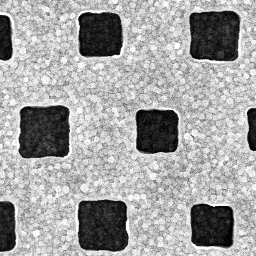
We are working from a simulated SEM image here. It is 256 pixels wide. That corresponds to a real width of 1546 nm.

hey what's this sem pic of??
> holes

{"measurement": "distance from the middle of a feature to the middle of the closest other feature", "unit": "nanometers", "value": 663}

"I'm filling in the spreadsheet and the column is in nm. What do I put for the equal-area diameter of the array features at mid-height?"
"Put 312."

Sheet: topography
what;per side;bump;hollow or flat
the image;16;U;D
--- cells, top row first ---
UUUUUUUUUUUUUUUU
DUUUUDDDUUUUDDDU
DUUUUDDDUUUUDDDU
DUUUUDDUUUUUDDDU
UUUUUUUUUUUUUUUU
UUUUUUUUUUUUUUUU
UUUUUUUUUUUUUUUU
UDDDUUUUUDDUUUUD
UDDDUUUUUDDUUUUD
UDDDUUUUUDDUUUUU
UUUUUUUUUUUUUUUU
UUUUUUUUUUUUUUUU
UUUUUUDUUUUUUUUU
DUUUUDDDUUUUDDDU
DUUUUDDDUUUUDDDU
DUUUUDDDUUUUUUUU